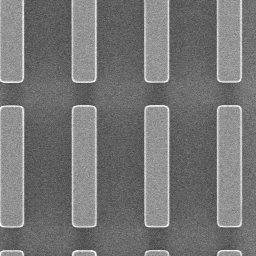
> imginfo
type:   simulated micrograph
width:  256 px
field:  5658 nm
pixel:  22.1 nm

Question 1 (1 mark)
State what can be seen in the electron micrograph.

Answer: groups of lines, slits or small figures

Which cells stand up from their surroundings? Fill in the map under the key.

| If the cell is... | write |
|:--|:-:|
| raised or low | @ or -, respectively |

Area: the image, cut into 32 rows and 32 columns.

@@@------@@@------@@@------@@@--
@@@------@@@------@@@------@@@--
@@@------@@@------@@@------@@@--
@@@------@@@------@@@------@@@--
@@@------@@@------@@@------@@@--
@@@------@@@------@@@------@@@--
@@@------@@@------@@@------@@@--
@@@------@@@------@@@------@@@--
@@@------@@@------@@@------@@@--
@@@------@@@------@@@------@@@--
--------------------------------
--------------------------------
--------------------------------
@@@------@@@------@@@------@@@--
@@@------@@@------@@@------@@@--
@@@------@@@------@@@------@@@--
@@@------@@@------@@@------@@@--
@@@------@@@------@@@------@@@--
@@@------@@@------@@@------@@@--
@@@------@@@------@@@------@@@--
@@@------@@@------@@@------@@@--
@@@------@@@------@@@------@@@--
@@@------@@@------@@@------@@@--
@@@------@@@------@@@------@@@--
@@@------@@@------@@@------@@@--
@@@------@@@------@@@------@@@--
@@@------@@@------@@@------@@@--
@@@------@@@------@@@------@@@--
--------------------------------
--------------------------------
--------------------------------
@@@------@@@------@@@------@@@--